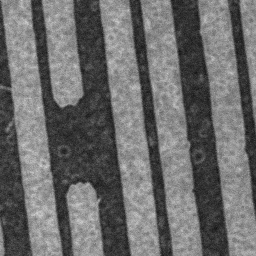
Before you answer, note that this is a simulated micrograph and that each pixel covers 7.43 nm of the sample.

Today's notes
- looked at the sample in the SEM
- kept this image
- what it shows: parallel lines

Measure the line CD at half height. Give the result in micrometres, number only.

0.218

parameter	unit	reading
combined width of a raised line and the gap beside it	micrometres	0.362